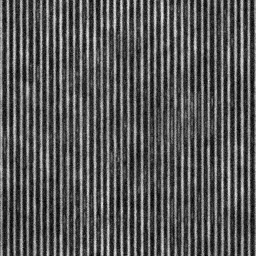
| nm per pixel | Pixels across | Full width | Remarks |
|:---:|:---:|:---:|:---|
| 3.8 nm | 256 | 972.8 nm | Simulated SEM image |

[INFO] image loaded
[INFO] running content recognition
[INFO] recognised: parallel lines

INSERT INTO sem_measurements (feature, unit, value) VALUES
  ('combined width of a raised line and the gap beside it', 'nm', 25.5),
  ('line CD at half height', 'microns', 0.0081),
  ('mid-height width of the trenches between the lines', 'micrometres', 0.0185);